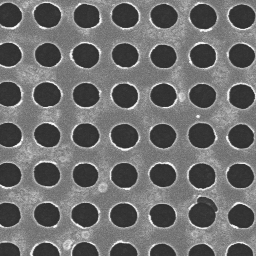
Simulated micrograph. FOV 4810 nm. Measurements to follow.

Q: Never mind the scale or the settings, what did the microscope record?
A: a regular array of holes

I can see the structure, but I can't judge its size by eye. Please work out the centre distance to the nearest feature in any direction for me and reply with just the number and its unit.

726 nanometres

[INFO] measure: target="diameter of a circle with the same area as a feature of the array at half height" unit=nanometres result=482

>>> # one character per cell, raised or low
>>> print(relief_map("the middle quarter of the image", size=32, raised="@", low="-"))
@@@@---@@@@@@@---@@@@@@----@@@@@
@@@@@@@@@@@@@@@@@@@@@@@@@@@@@@@@
@@@@@@@@@@@@@@@@@@@@@@@@@@@@@@@@
@@@@@@@@@@@@@@@@@@@@@@@@@@@@@@@@
@@@@@@@@@@@@@@@@@@@@@@@@@@@@@@@@
@@@-----@@@@@----@@@@@@----@@@@@
@@------@@@@------@@@@------@@@@
@@-------@@@------@@@@------@@@-
@@-------@@@-------@@@------@@@-
@@@-----@@@@@-----@@@@------@@@@
@@@@---@@@@@@@---@@@@@@@---@@@@@
@@@@@@@@@@@@@@@@@@@@@@@@@@@@@@@@
@@@@@@@@@@@@@@@@@@@@@@@@@@@@@@@@
@@@@@@@@@@@@@@@@@@@@@@@@@@@@@@@@
@@@@@@@@@@@@@@@@@@@@@@@@@@@@@@@@
@@@-----@@@@@----@@@@@@----@@@@@
@@@-----@@@@------@@@@------@@@-
@@-------@@@------@@@-------@@@-
@@-------@@@-------@@-------@@@-
@@@-----@@@@------@@@@------@@@@
@@@@---@@@@@@----@@@@@@----@@@@@
@@@@@@@@@@@@@@@@@@@@@@@@@@@@@@@@
@@@@@@@@@@@@@@@@@@@@@@@@@@@@@@@@
@@@@@@@@@@@@@@@@@@@@@@@@@@@@@@@@
@@@@@@@@@@@@@@@@@@@@@@@@@@@@@@@@
@@@-----@@@@@----@@@@@@----@@@@@
@@------@@@@------@@@@------@@@-
@@-------@@@------@@@-------@@@-
@@-------@@@------@@@-------@@@-
@@@-----@@@@------@@@@-----@@@@-
@@@@---@@@@@@----@@@@@@@--@@@@@@
@@@@@@@@@@@@@@@@@@@@@@@@@@@@@@@@